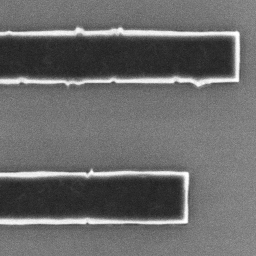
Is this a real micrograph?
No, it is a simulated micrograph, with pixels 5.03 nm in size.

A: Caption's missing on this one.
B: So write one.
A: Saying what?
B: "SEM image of one or a few lines or trenches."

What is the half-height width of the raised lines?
248 nanometers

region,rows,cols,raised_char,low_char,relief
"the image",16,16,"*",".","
................
................
***************.
***************.
***************.
................
................
................
................
................
................
************....
************....
************....
................
................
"